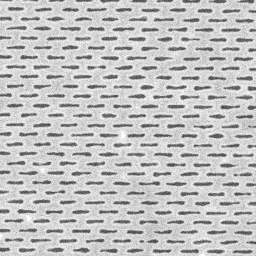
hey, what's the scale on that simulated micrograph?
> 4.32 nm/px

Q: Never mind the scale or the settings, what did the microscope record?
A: a regular array of holes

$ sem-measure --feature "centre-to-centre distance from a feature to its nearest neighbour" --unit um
0.0659